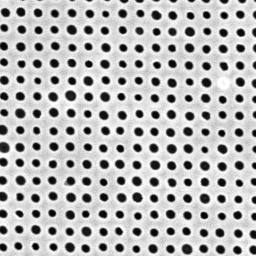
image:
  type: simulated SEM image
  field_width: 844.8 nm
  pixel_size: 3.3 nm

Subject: a regular array of holes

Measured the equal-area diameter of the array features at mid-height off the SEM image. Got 26.3 nanometers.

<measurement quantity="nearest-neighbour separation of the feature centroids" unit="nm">53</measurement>